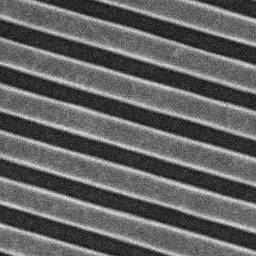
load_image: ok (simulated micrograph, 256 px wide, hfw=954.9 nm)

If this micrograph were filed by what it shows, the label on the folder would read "parallel lines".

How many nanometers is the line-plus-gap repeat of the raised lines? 166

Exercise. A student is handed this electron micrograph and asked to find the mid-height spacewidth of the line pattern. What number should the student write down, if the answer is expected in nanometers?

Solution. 69.7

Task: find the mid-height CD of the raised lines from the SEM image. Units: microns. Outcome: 0.0961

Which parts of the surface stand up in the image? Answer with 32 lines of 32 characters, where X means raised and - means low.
XXXXXX--------XXXXXXXXXXX-------
XXXXXXXXX--------XXXXXXXXXXXX---
-XXXXXXXXXXX---------XXXXXXXXXXX
----XXXXXXXXXXXX--------XXXXXXXX
-------XXXXXXXXXXXX---------XXXX
XX---------XXXXXXXXXXXX--------X
XXXXXX---------XXXXXXXXXXX------
XXXXXXXXX---------XXXXXXXXXXX---
--XXXXXXXXXXX--------XXXXXXXXXXX
-----XXXXXXXXXXX--------XXXXXXXX
--------XXXXXXXXXXXX--------XXXX
XXX---------XXXXXXXXXXX--------X
XXXXXXX--------XXXXXXXXXXXX-----
XXXXXXXXXX--------XXXXXXXXXXXX--
--XXXXXXXXXXXX--------XXXXXXXXXX
-----XXXXXXXXXXXX--------XXXXXXX
X--------XXXXXXXXXXX---------XXX
XXXX--------XXXXXXXXXXXX--------
XXXXXXX---------XXXXXXXXXXX-----
XXXXXXXXXXX--------XXXXXXXXXXXX-
---XXXXXXXXXXX--------XXXXXXXXXX
------XXXXXXXXXXXX--------XXXXXX
X---------XXXXXXXXXXX--------XXX
XXXXX--------XXXXXXXXXXX--------
XXXXXXXX--------XXXXXXXXXXXX----
XXXXXXXXXXX---------XXXXXXXXXXXX
---XXXXXXXXXXX---------XXXXXXXXX
-------XXXXXXXXXXX---------XXXXX
XX--------XXXXXXXXXXXX--------XX
XXXXX---------XXXXXXXXXXX-------
XXXXXXXX---------XXXXXXXXXXXX---
XXXXXXXXXXXX--------XXXXXXXXXXXX